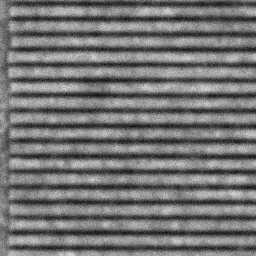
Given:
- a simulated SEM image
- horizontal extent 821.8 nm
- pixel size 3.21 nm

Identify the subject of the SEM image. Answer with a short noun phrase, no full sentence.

parallel lines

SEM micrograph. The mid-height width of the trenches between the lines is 0.0197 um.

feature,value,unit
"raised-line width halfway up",30.9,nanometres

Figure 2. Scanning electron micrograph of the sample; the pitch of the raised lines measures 49 nanometers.